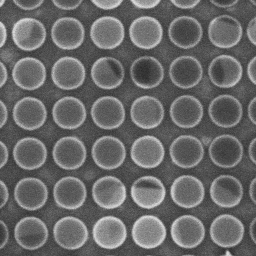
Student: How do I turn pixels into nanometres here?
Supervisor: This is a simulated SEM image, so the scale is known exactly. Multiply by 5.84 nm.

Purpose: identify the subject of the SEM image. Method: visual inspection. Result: a regular array of raised bodies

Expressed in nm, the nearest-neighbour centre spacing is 228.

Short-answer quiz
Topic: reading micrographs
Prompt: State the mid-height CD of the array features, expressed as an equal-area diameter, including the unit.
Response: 190 nm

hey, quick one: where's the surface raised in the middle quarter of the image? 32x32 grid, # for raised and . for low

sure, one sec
#####..#######...#######...#####
#####..########..########.######
#####..########..########.######
#####..########..########..#####
#####...######....######...#####
####.....####......####......###
................................
................................
##.......####......###.......###
####....######....######...#####
#####..########..#######...#####
#####..########..########..#####
#####..########..########..#####
#####..########..########..#####
#####...#######...######....####
####.....#####.....####......###
................................
................................
##.......####......####......###
####....######....######...#####
#####..########..########..#####
#####..########..########..#####
#####..########..########..#####
#####..########..########..#####
#####...#######...######....####
####.....#####.....####......###
................................
......#.........................
##....#..####......####......###
####....######....######....####
#####..########..########..#####
#####..########..########..#####